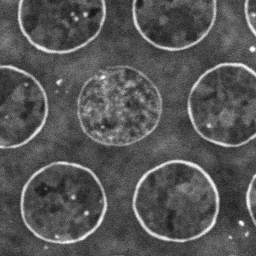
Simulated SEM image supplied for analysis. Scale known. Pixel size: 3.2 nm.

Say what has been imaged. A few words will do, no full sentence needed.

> raised bodies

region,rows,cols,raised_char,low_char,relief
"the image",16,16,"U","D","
DUUUUUDDUUUUUDDU
DUUUUUDDDUUUUDDD
DDUUUUDDDUUUDDDD
DDDDDDDDDDDDDDDD
UDDDDDDDDDDDDUUU
UUUDDDDDDDDDUUUU
UUUDDDDDDDDDUUUU
UUUDDDDDDDDDUUUU
UUDDDDDDDDDDDUUU
DDDDDDDDDDDDDDDD
DDDUUDDDDDUUDDDD
DDUUUUDDDUUUUDDD
DUUUUUUDUUUUUUDD
DUUUUUDDDUUUUDDD
DDUUUUDDDUUUUDDD
DDDDDDDDDDDDDDDD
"